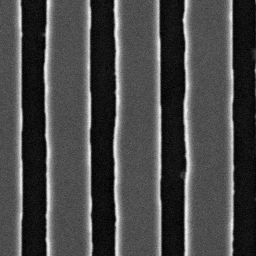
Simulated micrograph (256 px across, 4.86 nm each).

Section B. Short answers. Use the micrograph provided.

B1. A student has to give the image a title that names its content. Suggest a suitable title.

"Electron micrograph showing lines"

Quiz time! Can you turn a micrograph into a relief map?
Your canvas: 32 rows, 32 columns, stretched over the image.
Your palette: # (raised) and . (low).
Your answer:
##....#####...######...######...
###...#####...######...######...
###...#####...######...######...
###...#####...######...######...
###...#####...######...######...
###...#####....#####...######...
###...#####....#####...######...
###...#####....#####...######...
###...#####....#####...######...
###...#####....#####...######...
###...#####....#####...######...
###...#####....#####...######...
###...#####....#####...######...
###...#####....#####...######...
###...#####....#####...######...
###...#####...######...######...
###...#####...######...######...
###...#####...######...######...
###...#####...######...######...
###...#####...######...######...
###...#####...######...######...
###...#####...######...######...
###...#####...######...######...
###...#####...######...######...
###...#####...######...######...
###...#####...######...######...
###...#####....#####...######...
###...#####....#####...######...
###...#####....#####...######...
###...#####....#####...######...
###...######..######...######...
###...#####....#####...######...